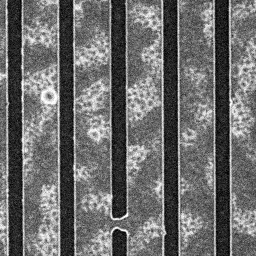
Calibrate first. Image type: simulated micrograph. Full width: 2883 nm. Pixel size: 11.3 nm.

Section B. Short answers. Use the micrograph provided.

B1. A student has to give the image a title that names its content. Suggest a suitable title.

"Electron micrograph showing parallel lines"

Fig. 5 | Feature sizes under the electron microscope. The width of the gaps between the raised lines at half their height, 15.5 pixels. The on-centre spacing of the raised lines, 585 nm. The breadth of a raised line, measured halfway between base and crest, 407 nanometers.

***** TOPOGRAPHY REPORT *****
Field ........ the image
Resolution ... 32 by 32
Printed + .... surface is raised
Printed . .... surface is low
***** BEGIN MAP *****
+..++++..+++++..++++..+++++..+++
+..++++..+++++..++++..+++++..+++
+..++++..+++++..++++..+++++..+++
+..++++..+++++..++++..+++++..+++
+..++++..+++++..++++..+++++..+++
+..++++..+++++..++++..+++++..+++
+..++++..+++++..++++..+++++..+++
+..++++..+++++..++++..+++++..+++
+..++++..+++++..++++..+++++..+++
+..++++..+++++..++++..+++++..+++
+..++++..+++++..++++..+++++..+++
+..++++..+++++..++++..+++++..+++
+..++++..+++++..++++..+++++..+++
+..++++..+++++..++++..+++++..+++
+..++++..+++++..++++..+++++..+++
+..++++..+++++..++++..+++++..+++
+..++++..+++++..++++..+++++...++
+..++++..+++++..++++..+++++..+++
+..++++..+++++..++++..+++++..+++
+..++++..+++++..++++..+++++..+++
+..++++..+++++..++++..+++++..+++
+..++++..+++++..++++..+++++..+++
+..++++..+++++..++++..+++++..+++
+..++++..+++++..++++..+++++..+++
+..++++..+++++..++++..+++++..+++
+..++++..+++++..++++..+++++..+++
+..++++..+++++..++++..+++++..+++
+..++++..+++++++++++..+++++..+++
+..++++..+++++++++++..+++++..+++
+..++++..+++++..++++...++++..+++
+..++++..+++++..++++...++++..+++
+..++++..+++++..++++..+++++..+++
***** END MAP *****